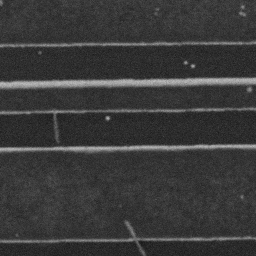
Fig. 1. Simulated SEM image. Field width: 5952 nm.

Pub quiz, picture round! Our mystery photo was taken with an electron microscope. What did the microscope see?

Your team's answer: lines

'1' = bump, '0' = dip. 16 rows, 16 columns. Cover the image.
1111111111111111
1111111111111111
1111111111111111
0000000000000000
0000000000000000
1111111111111111
1111111111111111
0000000000000000
0000000000000000
1111111111111111
1111111111111111
1111111111111111
1111111111111111
1111111111111111
1111111111111111
0000000000000000